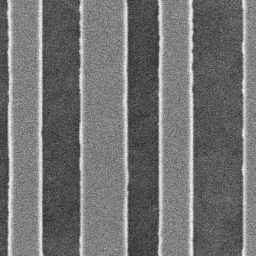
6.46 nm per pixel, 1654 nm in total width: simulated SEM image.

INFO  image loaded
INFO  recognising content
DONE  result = lines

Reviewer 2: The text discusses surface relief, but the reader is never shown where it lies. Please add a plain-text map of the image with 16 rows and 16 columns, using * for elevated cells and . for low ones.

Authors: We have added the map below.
.**..***..**...*
.**..***..**...*
.**..***..**...*
.**..***..**...*
.**..***..**...*
.**..***..**...*
.**..***..**...*
.**..***..**...*
.**..***..**...*
.**..***..**...*
.**..***..**...*
.**..***..**...*
.**..***..**...*
.**..***..**...*
.**..***..**...*
.**..***..**...*